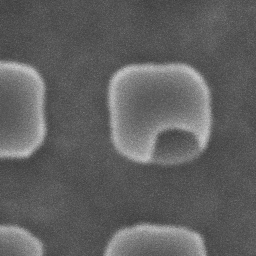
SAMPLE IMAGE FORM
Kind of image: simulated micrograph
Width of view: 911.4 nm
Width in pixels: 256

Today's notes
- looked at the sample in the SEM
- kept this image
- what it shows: raised bodies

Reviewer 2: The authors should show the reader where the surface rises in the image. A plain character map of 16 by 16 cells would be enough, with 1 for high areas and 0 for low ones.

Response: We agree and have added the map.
0000000000000000
0000000000000000
0000000000000000
0000000000000000
1100000011110000
1110000111111000
1110000111111000
1110000111111000
1110000111001000
1100000010000000
0000000000000000
0000000000000000
0000000000000000
0000000000000000
1100000011110000
1110000111111000